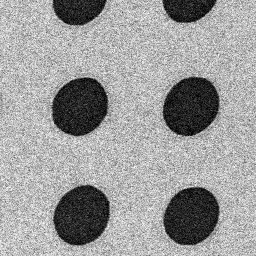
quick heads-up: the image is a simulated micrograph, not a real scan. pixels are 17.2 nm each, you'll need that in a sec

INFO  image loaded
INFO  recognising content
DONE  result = holes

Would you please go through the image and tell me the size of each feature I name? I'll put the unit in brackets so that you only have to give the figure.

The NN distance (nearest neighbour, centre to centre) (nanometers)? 1880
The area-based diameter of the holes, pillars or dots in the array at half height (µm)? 0.98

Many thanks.